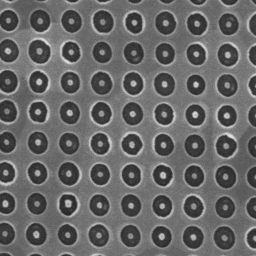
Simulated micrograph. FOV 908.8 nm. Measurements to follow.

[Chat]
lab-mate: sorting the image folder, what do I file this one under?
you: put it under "a regular array of ring-shaped grooves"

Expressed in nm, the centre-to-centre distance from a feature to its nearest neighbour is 108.